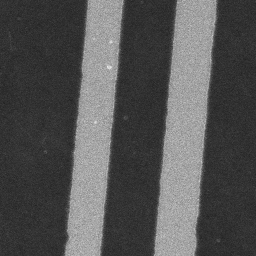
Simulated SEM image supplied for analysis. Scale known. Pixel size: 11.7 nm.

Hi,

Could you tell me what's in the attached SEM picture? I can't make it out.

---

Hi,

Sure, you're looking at one or a few lines or trenches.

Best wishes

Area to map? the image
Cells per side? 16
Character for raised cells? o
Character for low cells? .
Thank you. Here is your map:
oooooo..ooo..ooo
ooooo...ooo..ooo
ooooo..oooo..ooo
ooooo..oooo..ooo
ooooo..oooo..ooo
ooooo..oooo..ooo
ooooo..oooo..ooo
ooooo..ooo...ooo
ooooo..ooo...ooo
ooooo..ooo...ooo
ooooo..ooo...ooo
ooooo..ooo..oooo
oooo...ooo..oooo
oooo..oooo..oooo
oooo..oooo..oooo
oooo..oooo..oooo